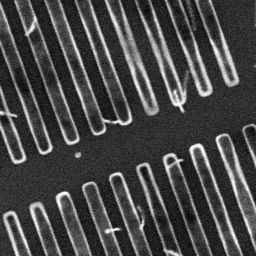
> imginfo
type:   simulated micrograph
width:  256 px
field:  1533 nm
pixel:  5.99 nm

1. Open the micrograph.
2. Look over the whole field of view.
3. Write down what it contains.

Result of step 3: groups of lines, slits or small figures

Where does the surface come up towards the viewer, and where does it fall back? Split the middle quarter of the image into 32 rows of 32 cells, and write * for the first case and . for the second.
.****....***.....**.....***.....
..***....****....***.....***....
..****...****....***.....***....
..****....***.....***....***....
...***....****....***....****...
...****....***....***.....***...
...****....****....***....***...
....***....****....***.....***..
....****....***....***.....***..
*....***....****....***....***..
*....****...****....***.........
*....****....***.....**.........
**...****....****...............
**....****...****...............
**....****....**................
***....***......................
***....***......................
***.............................
****............................
.**.............................
................................
................................
................................
.........................***....
.........................****...
...................**.....***...
...................***....***...
.............*.....***....****..
............***....***....****..
............***.....***....****.
.....***....****....***....****.
.....****...****....***....****.